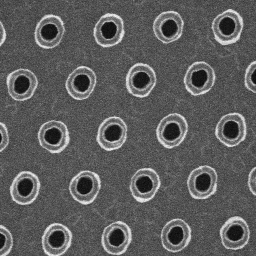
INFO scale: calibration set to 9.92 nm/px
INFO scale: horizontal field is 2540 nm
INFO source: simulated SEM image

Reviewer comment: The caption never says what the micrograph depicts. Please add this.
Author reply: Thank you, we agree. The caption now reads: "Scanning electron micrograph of a regular array of ring-shaped raised bodies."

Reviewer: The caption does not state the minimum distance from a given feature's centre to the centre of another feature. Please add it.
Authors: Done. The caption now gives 584 nm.